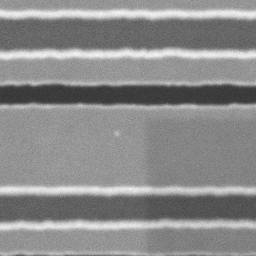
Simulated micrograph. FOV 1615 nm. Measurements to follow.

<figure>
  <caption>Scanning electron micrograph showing lines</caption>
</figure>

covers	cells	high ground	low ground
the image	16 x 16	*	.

****************
................
................
.***************
****************
................
................
****************
****************
****************
****************
****************
................
................
****************
****************